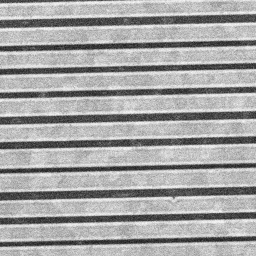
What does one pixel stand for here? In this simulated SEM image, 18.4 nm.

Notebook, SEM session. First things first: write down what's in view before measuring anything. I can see parallel lines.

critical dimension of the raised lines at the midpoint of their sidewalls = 268 nanometers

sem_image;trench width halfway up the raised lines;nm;167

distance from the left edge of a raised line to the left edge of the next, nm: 451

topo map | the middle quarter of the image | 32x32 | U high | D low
UDDDDDDDDDDDDDDDDDDDDDDDDDDDDDDD
DDDDDDDDDDDDDDDDDDDDDDDDDDDDDDDD
DDDDDDDDDDDDDUUUUUUUUUUUUUUUUUUU
UUUUUUUUUUUUUUUUUUUUUUUUUUUUUUUU
UUUUUUUUUUUUUUUUUUUUUUUUUUUUUUUU
UUUUUUUUUUUUUUUUUUUUUUUUUUUUUUUU
DDDDDDDDDDDDDDDDDDDDDDDDDDDDDDDD
DDDDDDDDDDDDDDDDDDDDDDDDDDDDDDDD
DDDDDDDDDDDUUDDDDDUUUUUUUUUUUUUU
UUUUUUUUUUUUUUUUUUUUUUUUUUUUUUUU
UUUUUUUUUUUUUUUUUUUUUUUUUUUUUUUU
UUUUUUUUUUUUUUUUUUUUUUUUUUUUUDUU
DDDDDDDDDDDDDDDDDDDDDDDDDDDDDDDD
DDDDDDDDDDDDDDDDDDDDDDDDDDDDDDDD
DDDDDDDDDDDDDDDDDDDDDDDDDDDDUUUU
UUUUUUUUUUUUUUUUUUUUUUUUUUUUUUUU
UUUUUUUUUUUUUUUUUUUUUUUUUUUUUUUU
UUUUUUUUUUUUUUUUUUUUUUUUUUUUUUUU
UUUUUDDUUUUUDDDDDDDDDDDDDDDDDDDD
DDDDDDDDDDDDDDDDDDDDDDDDDDDDDDDD
DDDDDDDDDDDDDDDDDDDDDDDDDDDDDDDD
DUUUUUUUUUUUUUUUUUUUUUUUUUUUUUUU
UUUUUUUUUUUUUUUUUUUUUUUUUUUUUUUU
UUUUUUUUUUUUUUUUUUUUUUUUUUUUUUUU
UUUUUUUUUUUUUUUUUUUUUUUUUUUUUUUU
DDDDDDDDDDDDDDDDDDDDDDDDDDDDDDDD
DDDDDDDDDDDDDDDDDDDDDDDDDDDDDDDD
UUUUUUUUUUUUUUUUUUUUUUUUUUUUUUUU
UUUUUUUUUUUUUUUUUUUUUUUUUUUUUUUU
UUUUUUUUUUUUUUUUUUUUUUUUUUUUUUUU
UUUUUUUUUUUUUUUUUUUUUUUUUUUUDDUU
DDDDDDDDDDDDDDDDDDDDDDDDDDDDDDDD